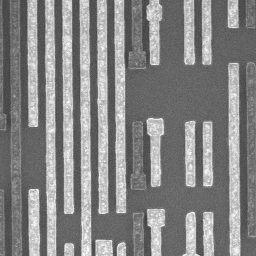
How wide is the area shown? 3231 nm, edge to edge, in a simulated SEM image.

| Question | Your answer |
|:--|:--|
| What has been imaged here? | wiring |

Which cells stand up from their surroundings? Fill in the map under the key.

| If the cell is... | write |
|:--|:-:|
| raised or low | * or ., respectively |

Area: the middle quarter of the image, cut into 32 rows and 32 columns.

**..**...**..**.****............
**..**...**..**.................
**..**...**..**.................
**..**...**..**.................
**..**...**..**.................
**..**...**..**.................
**..**...**..**.................
**..**...**..**.................
**..**...**..**.................
**..**...**..**.................
**..**...**..**.................
**..**...**..**.................
**..**...**..**.................
**..**...**..**.................
**..**...**..**......****......*
**..**...**..**..***.****.....**
**..**...**..**..***.****.....**
**..**...**..**..***.****.....**
**..**...**..**..***..**......**
**..**...**..**..***..**......**
**..**...**..**..***..**......**
**..**...**..**..***..**......**
**..**...**..**..***..**......**
**..**...**..**..***..**......**
**..**...**..**..***..**......**
**..**...**..**..***..**.......*
**..***..**..**..***..**.......*
**..***..**..**..***..**.......*
**..***..**..**..***..**.......*
**..***..**..**..***..**.......*
**..***..**..**..***............
**..***..**..**.................